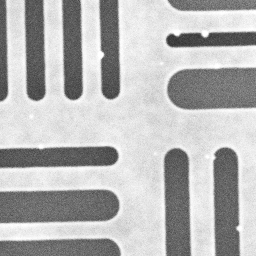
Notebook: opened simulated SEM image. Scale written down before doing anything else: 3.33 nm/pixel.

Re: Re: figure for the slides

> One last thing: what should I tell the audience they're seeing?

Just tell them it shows groups of lines, slits or small figures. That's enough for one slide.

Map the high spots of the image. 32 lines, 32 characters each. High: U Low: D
DUUDDDUUDDUUDDDUUUUUUDDDDDDDDDDD
DUUDDDUUDDUUDDDUUUUUUUUDDDUUUUUU
DUUDDDUUDDUUDDDUUUUUUUUUUUUUUUUU
DUUDDDUUDDUUDDDUUUUUUUUUUUUUUUUU
DUUDDDUUDDUUDDDUUUUUUDDDDDDDDDDD
DUUDDDUUDDUUUDDUUUUUUDDDDDDDDDDD
DUUDDDUUDDUUUDDUUUUUUUUUUUUUUUUU
DUUDDDUUDDUUUDDUUUUUUUUUUUUUUUUU
DUUDDDUUDDUUUDDUUUUUUUUUDDDDDDDD
DUUDDDUUDDUUUDDUUUUUUDDDDDDDDDDD
DUUDDDUUDDUUUDDUUUUUUDDDDDDDDDDD
DUUDDDUUDDUUUDDUUUUUUDDDDDDDDDDD
UUUUDUUUUUUUUUUUUUUUUDDDDDDDDDDD
UUUUUUUUUUUUUUUUUUUUUUDDDDDDDDDD
UUUUUUUUUUUUUUUUUUUUUUUUUUUUUUUU
UUUUUUUUUUUUUUUUUUUUUUUUUUUUUUUU
UUUUUUUUUUUUUUUUUUUUUUUUUUUUUUUU
UUUUUUUUUUUUUUUUUUUUUUUUUUUUUUUU
UUDDUUDDDDDDDDUUUUUUUUUUUUUUDUUU
DDDDDDDDDDDDDDDUUUUUUDDDUUUDDDUU
DDDDDDDDDDDDDDUUUUUUDDDDUUUDDDUU
UUUUUUUUUUUUUUUUUUUUDDDDUUUDDDUU
UUUUUUUUUUUUUUUUUUUUDDDDUUUDDDUU
UUUUUUUUUUUUUUUUUUUUDDDDUUUDDDUU
DDDDDDDDDDDDDDDUUUUUUDDDUUUDDDUU
DDDDDDDDDDDDDDDUUUUUUDDDUUUDDDUU
DDDDDDDDDDDDDDDUUUUUUDDDUUUDDDUU
DDDDDDDDDDDDDDUUUUUUUDDDUUUDDDUU
UUUUUUUUUUUUUUUUUUUUUDDDUUUDDDUU
UUUUUUUUUUUUUUUUUUUUUDDDUUUDDDUU
DDDDDDDDDDDDDDDUUUUUUDDDUUUDDDUU
DDDDDDDDDDDDDDDUUUUUUDDDUUUDDDUU